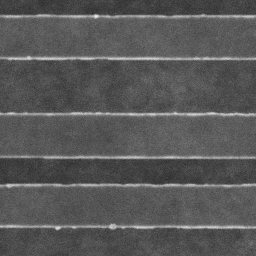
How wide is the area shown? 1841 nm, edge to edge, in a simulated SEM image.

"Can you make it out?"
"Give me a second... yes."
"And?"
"lines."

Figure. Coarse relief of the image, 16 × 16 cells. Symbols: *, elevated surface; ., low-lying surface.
................
****************
****************
****************
................
................
................
****************
****************
****************
................
................
****************
****************
................
................